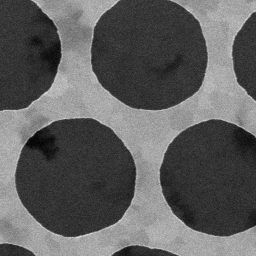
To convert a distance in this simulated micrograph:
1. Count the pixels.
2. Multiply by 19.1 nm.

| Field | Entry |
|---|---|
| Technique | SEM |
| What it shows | holes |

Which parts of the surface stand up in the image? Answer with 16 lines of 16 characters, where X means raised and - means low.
---XXXX-----XXXX
---XXX------XXX-
----XX-------XX-
----XX-------XX-
----XX-------XX-
---XXX------XXX-
--XXXXXX---XXXXX
XXXX--XXXXXXX-XX
XX-----XXXX-----
X-------XX------
X--------X------
X-------XX------
X-------XX------
XX------XXX-----
XXX---XXXXXX---X
--XXXXXX--XXXXXX